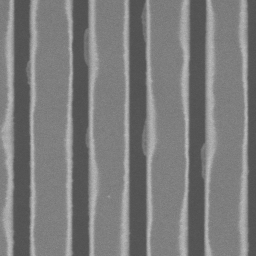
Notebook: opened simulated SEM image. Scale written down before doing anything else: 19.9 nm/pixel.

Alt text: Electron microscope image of lines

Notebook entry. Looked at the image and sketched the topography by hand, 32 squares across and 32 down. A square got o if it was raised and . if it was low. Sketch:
oo..ooooo..ooooo..oooooo..ooooo.
oo..ooooo..ooooo..ooooo...ooooo.
oo..ooooo..ooooo..ooooo...ooooo.
oo..ooooo..ooooo..ooooo...ooooo.
oo..ooooo..ooooo..ooooo...ooooo.
oo..ooooo..ooooo..oooooo..ooooo.
oo..ooooo..ooooo..oooooo..ooooo.
oo..ooooo..ooooo..oooooo..ooooo.
oo..ooooo..ooooo..oooooo..ooooo.
oo..ooooo..ooooo..ooooo...ooooo.
oo..ooooo..ooooo..ooooo...ooooo.
oo..ooooo..ooooo..ooooo...ooooo.
oo..ooooo..ooooo..ooooo...ooooo.
oo..ooooo..ooooo..ooooo...ooooo.
oo..ooooo..ooooo..oooooo..ooooo.
o...ooooo..ooooo..oooooo..ooooo.
o...ooooo..ooooo..ooooo...ooooo.
o...ooooo..ooooo..ooooo...ooooo.
o...ooooo..ooooo..ooooo...ooooo.
oo..ooooo..ooooo..oooooo..ooooo.
o...ooooo..ooooo..oooooo..ooooo.
oo..ooooo..ooooo..oooooo..ooooo.
oo..ooooo..ooooo..ooooo...ooooo.
oo..ooooo..ooooo..ooooo...ooooo.
o...ooooo..ooooo..ooooo...ooooo.
o...ooooo..ooooo..ooooo...ooooo.
o...ooooo..ooooo..ooooo...ooooo.
o...ooooo..ooooo..ooooo...ooooo.
o...ooooo..ooooo..ooooo...ooooo.
o...ooooo..ooooo..ooooo...ooooo.
oo..ooooo..ooooo..ooooo...ooooo.
o...ooooo..ooooo..ooooo...ooooo.